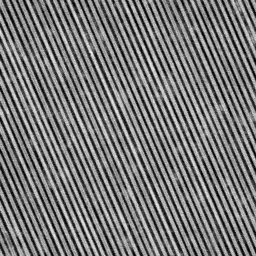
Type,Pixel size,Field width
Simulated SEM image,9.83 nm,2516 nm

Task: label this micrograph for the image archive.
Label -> parallel lines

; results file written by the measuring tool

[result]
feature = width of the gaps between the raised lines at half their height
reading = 39.4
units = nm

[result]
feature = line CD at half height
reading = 25.9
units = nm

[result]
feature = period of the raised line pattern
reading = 61.6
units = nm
